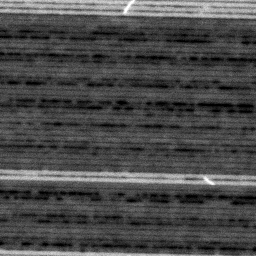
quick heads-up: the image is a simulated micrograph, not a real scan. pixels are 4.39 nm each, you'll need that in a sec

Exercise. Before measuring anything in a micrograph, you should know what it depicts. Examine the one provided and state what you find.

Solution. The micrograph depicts parallel lines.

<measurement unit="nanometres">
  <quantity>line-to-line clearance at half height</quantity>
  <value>6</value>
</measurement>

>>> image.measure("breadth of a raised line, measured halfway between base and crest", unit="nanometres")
19.2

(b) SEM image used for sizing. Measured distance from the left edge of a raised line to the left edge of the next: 25.2 nm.